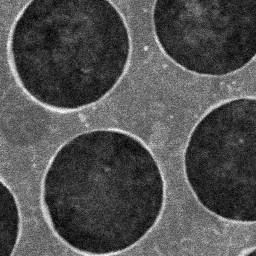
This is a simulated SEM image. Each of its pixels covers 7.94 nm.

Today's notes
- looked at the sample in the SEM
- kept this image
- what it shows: holes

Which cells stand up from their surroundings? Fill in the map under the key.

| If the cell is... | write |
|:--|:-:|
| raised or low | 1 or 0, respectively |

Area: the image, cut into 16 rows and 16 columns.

1100000111000000
1000000011000000
1000000011000000
1000000011100000
1000000011110011
1100000111111111
1110001111111100
1111111111111000
1111100011110000
1111000001110000
1110000000110000
1110000000110000
0110000000110000
0110000000111100
0111000001111111
0111100011111111